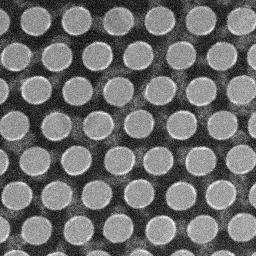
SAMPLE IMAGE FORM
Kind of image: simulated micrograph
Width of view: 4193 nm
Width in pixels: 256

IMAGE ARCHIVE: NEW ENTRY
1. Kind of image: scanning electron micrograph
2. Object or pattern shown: a regular array of raised bodies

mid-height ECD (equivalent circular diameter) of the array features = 28.4 pixels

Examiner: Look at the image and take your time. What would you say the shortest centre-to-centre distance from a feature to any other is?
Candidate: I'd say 39.5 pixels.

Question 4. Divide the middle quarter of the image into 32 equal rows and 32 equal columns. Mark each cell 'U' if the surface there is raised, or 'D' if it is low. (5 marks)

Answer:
UDDDDDUUUUUDDDDDUUUUUDDDDDDUUUUD
DDDDDDDDDDDDDDDUDDDDDDDDDDDDDDDD
DDDDDDDDDDDDDDDDDDDDDDDDDDDDDDDD
DDDUDDDDDDDDDUDDDDDDDDDUUUDDDDDD
DUUUUUDDDDDUUUUUDDDDDDUUUUUDDDDD
UUUUUUUDDDUUUUUUUDDDDUUUUUUUDDDU
UUUUUUUDDDUUUUUUUDDDDUUUUUUUDDDU
UUUUUUUDDDUUUUUUUDDDDUUUUUUUDDDU
UUUUUUDDDDUUUUUUUDDDDUUUUUUDDDDU
DUUUUDDDDDDUUUUUDDDDDDUUUUDDDDDD
DDDDDDDDDDDDDDDDDDDDDDDDDDDDDDDD
DDDDDDDDDDDDDDDDDDDDDDDDDDDDDDDD
DDDDDDDUUUUDDDDDDUUUUDDDDDDDUUUU
UDDDDDUUUUUUDDDDUUUUUUDDDDDUUUUU
UUDDDUUUUUUUDDDUUUUUUUDDDDUUUUUU
UUDDDUUUUUUUDDDUUUUUUUDDDDUUUUUU
UUDDDUUUUUUUDDDUUUUUUUDDDDUUUUUU
UDDDDDUUUUUDDDDDUUUUUDDDDDDUUUUU
DDDDDDDUUUDDDDDDDDDDDDDDDDDDUUUD
DDDDDDDDDDDDDDDDDDDDDDDDDDDDDDDD
DDDDDDDDDDDDDDDDDDDDDDDDDDDDDDDD
DUUUUUDDDDDDUUUUDDDDDDUUUUDDDUDD
UUUUUUDDDDDUUUUUUDDUDUUUUUUDDUDU
UUUUUUUDDDUUUUUUUDDDUUUUUUUDDDDU
UUUUUUUDDDUUUUUUUDDDUUUUUUUDDDDU
UUUUUUDDDDUUUUUUUDDDUUUUUUUDDDDU
UUUUUDDDDDDUUUUUDDDDDUUUUUDDDDDU
DDUDDDDDDDDDDUDDDDDDDDUUDDDDDDDD
DDDDDDDDDDDDDDDDDDDDDDDDDDDDDDDD
DDDDDDDDUDDDDDDDDUUUUDDDDDDDDDDD
UDDDDDUUUUUDDDDDUUUUUUDDDDDUUUUU
UUDDDUUUUUUUDDDUUUUUUUDDDDUUUUUU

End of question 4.